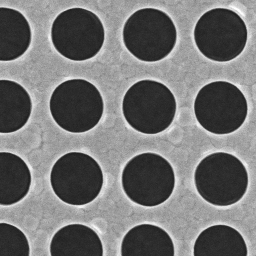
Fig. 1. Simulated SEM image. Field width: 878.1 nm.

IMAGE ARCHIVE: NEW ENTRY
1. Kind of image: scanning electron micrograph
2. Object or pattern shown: a regular array of holes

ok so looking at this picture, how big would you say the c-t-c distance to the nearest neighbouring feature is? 245 nm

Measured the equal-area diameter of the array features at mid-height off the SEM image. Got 0.183 µm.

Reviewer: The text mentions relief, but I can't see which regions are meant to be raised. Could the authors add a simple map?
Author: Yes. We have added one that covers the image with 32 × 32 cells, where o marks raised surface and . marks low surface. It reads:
oooooooooooooooooooooooooooooooo
..oooooo...oooooo...oooooo...ooo
...oooo.....oooo.....oooo.....oo
....ooo......oo.......oo.......o
....oo.......oo.......oo.......o
....ooo......ooo......ooo......o
...oooo.....oooo.....oooo.....oo
..ooooooo.oooooooo..ooooooo..ooo
oooooooooooooooooooooooooooooooo
oooooooooooooooooooooooooooooooo
..oooooo...oooooo...oooooo...ooo
...oooo.....oooo.....oooo.....oo
....oo.......oo.......oo.......o
....oo.......oo.......oo.......o
....ooo......ooo......oo.......o
...oooo.....oooo.....oooo.....oo
..ooooooo.ooooooo...oooooo...ooo
oooooooooooooooooooooooooooooooo
oooooooooooooooooooooooooooooooo
..oooooo...oooooo...oooooo...ooo
...oooo.....oooo.....oooo.....oo
....oo.......oo.......oo.......o
....oo.......oo.......oo.......o
....ooo......oo.......ooo......o
...oooo.....oooo.....oooo.....oo
..ooooooo..oooooo...ooooooo..ooo
oooooooooooooooooooooooooooooooo
oooooooooooooooooooooooooooooooo
..oooooo...oooooo...oooooo...ooo
...oooo.....oooo.....oooo.....oo
....oo.......oo.......oo.......o
....oo.......oo.......oo.......o